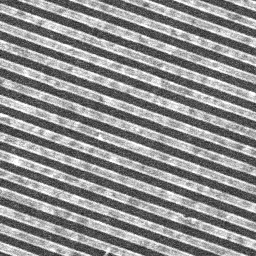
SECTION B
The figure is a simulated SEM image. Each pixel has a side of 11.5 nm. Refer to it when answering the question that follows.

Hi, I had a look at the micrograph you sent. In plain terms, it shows parallel lines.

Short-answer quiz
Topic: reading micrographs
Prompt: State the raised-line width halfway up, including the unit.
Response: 7.19 px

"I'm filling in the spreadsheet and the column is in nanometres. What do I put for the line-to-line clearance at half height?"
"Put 114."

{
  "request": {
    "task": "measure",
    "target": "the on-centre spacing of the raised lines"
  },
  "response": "0.199 micrometres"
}